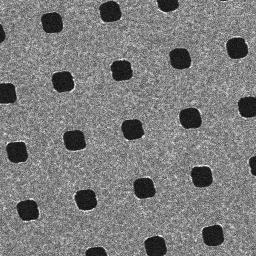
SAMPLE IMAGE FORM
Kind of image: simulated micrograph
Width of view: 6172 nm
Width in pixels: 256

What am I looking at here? a regular array of holes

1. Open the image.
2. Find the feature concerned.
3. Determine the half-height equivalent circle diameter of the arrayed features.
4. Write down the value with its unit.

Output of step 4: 542 nm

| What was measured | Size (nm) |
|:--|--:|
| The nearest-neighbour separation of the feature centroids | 1420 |